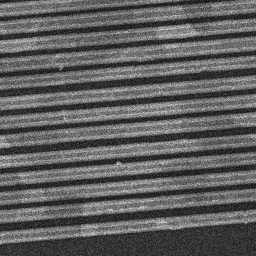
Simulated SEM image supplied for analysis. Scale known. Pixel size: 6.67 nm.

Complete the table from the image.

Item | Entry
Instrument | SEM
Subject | parallel lines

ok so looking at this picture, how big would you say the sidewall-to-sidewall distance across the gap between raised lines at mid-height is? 66.4 nanometers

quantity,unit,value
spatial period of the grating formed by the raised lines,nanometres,127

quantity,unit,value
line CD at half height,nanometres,59.8